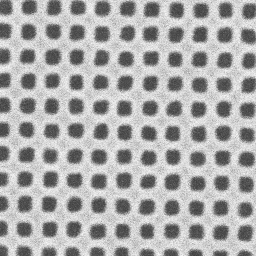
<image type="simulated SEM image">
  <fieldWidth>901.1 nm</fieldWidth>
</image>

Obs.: a regular array of holes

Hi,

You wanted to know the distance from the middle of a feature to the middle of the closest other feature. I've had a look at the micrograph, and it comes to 84.2 nanometers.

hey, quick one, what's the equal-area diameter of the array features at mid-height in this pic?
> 17.4 px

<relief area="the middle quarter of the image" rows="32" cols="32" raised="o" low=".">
oooooooo..oooo...ooo...ooo...ooo
oooooooooooooooooooooooooooooooo
ooo.oooooooooooooooooooooooooooo
o....ooo...ooo...ooo....oo....oo
o....oo....oo....ooo....oo....oo
o....oo....oo....ooo...ooo....oo
oo..oooo.ooooo...ooo...ooo...ooo
oooooooooooooooooooooooooooooooo
oo..oooooooooooooooooooooooooooo
o....ooo...ooo...ooo...oooo..ooo
o....oo.....o....oo.....oo...ooo
o....oo....oo....ooo....oo....oo
oo...oo....oo....ooo...ooo...ooo
oooooooooooooooooooooooooooooooo
ooo.oooooooooooooooooooooooooooo
o....ooo...ooo...ooo..oooo...ooo
o....oo....oo....oo....oo....ooo
o....oo....oo....oo....oo....ooo
oo..oooo...oo....oo....oo....ooo
oooooooooooooooooooooooooooooooo
oooooooooooooooooooooooooooooooo
o....oo...oooo...ooo..oooo...ooo
o....oo....oo....oo....oo....ooo
.....o.....oo....oo....oo....oo.
o...ooo....oo....oo....ooo...oo.
oooooooooooooooooooo..oooooooooo
oooooooooooooooooooooooooooooooo
o...ooo...ooo....ooooooooo...ooo
.....oo....oo....oo....oo....ooo
.....oo....oo....oo....oo....oo.
o...ooo....oo....oo....oo....oo.
oooooooo..oooooooooo.ooooo...ooo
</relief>